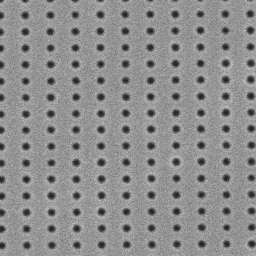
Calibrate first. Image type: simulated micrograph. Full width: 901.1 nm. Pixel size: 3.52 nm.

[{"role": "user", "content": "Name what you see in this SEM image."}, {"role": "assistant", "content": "a regular array of holes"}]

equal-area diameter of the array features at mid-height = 0.0281 micrometres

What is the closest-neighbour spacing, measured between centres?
56.7 nm